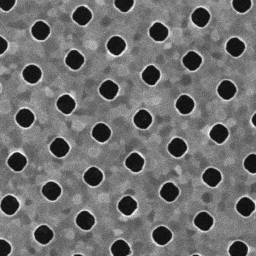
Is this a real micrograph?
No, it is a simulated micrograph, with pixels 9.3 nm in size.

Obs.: a regular array of holes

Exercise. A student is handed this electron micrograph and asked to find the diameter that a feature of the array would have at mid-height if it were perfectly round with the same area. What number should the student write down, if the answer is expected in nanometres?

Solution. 178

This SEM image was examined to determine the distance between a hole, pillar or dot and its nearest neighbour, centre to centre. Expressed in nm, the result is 409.